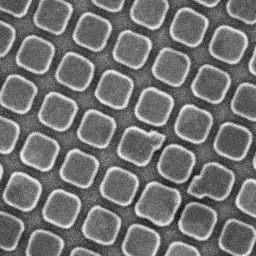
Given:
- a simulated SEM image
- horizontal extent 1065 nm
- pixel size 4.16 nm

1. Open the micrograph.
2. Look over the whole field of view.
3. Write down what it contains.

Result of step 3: a regular array of raised bodies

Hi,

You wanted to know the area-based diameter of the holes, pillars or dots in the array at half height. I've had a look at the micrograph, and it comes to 150 nanometers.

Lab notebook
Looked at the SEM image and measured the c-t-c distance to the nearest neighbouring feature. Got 179 nanometers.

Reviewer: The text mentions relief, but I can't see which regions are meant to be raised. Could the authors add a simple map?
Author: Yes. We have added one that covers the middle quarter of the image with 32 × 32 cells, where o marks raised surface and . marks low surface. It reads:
ooooooo.........ooo...ooooooooo.
ooooooo...............ooooooooo.
ooooooo...oooo........ooooooooo.
ooooooo..ooooooo.......ooooooo..
oooooo...oooooooo........ooooo..
.ooooo..ooooooooo..........o....
...oo...ooooooooo...ooo.........
........oooooooo...oooooo.......
........oooooooo...oooooooo.....
oo........oooooo...oooooooo.....
ooo.........ooo...ooooooooo....o
ooo...............ooooooooo..ooo
ooo..ooooo........oooooooo...ooo
oo...ooooooo.......ooooooo...ooo
oo...oooooooo........oooo...oooo
o...ooooooooo...............oooo
....ooooooooo...ooo.........oooo
....oooooooo...oooooo.oo....oooo
....oooooooo...oooooooooo.....oo
.....oooooo...ooooooooooo.......
........ooo...oooooooooo..oo....
..............oooooooo...oooooo.
.ooooo........oooooooo...ooooooo
.ooooooo.......ooooooo..oooooooo
oooooooo.........oooo...oooooooo
oooooooo................oooooooo
oooooooo...oooo.........oooooooo
oooooooo...oooooo.......oooooooo
ooooooo...oooooooo........ooooo.
.oooooo...oooooooo..........oo..
...ooo...ooooooooo...oooo.......
.........ooooooooo..oooooooo...o